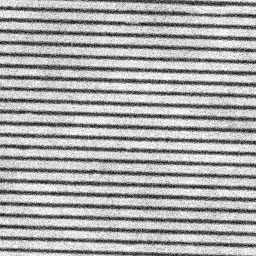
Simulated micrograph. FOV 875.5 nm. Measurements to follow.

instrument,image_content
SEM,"parallel lines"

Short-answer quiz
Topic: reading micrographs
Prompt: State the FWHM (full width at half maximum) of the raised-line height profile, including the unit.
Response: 0.0226 micrometres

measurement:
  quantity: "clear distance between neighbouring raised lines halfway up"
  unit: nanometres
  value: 15.8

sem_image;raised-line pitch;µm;0.0392